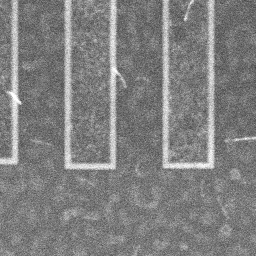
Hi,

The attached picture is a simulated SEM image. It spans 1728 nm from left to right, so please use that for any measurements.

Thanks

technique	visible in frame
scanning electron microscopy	one or a few lines or trenches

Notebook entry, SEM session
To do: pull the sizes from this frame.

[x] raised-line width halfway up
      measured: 47.1 pixels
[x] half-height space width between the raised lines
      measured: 347 nm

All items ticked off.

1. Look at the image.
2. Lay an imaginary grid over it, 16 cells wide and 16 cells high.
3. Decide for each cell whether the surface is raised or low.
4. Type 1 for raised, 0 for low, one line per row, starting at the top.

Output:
1000111000111000
1000111000111000
1000111000111000
1000111000111000
1000111000111000
1000111000111000
1000111000111000
1000111000111000
1000111000111000
1000111000111000
0000000000000000
0000000000000000
0000000000000000
0000000000000000
0000000000000000
0000000000000000